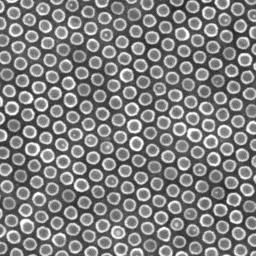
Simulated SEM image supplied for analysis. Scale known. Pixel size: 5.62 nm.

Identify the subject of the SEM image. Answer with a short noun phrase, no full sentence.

a regular array of raised bodies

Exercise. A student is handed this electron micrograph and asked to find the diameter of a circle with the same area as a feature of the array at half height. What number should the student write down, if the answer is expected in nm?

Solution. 69.7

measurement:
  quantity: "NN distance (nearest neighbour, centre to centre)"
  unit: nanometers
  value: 94.1